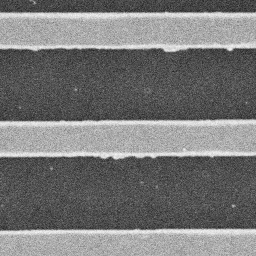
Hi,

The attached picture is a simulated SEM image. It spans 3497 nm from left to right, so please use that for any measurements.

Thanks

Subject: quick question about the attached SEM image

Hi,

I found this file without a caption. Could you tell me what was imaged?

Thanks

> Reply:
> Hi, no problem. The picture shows lines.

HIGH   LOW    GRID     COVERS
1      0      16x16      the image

0000000000000000
1111111111111111
1111111111111111
0000000000000000
0000000000000000
0000000000000000
0000000000000000
0000000000000000
1111111111111111
1111111111111111
0000000000000000
0000000000000000
0000000000000000
0000000000000000
1111111111111111
1111111111111111